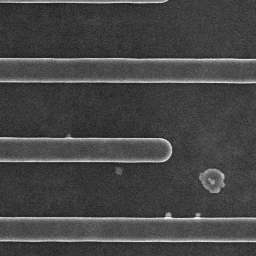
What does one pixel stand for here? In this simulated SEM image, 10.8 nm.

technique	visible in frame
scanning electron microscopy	groups of lines, slits or small figures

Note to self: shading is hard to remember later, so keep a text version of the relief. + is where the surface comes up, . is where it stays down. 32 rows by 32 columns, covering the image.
................................
................................
................................
................................
................................
................................
................................
++++++++++++++++++++++++++++++.+
++++++++++++++++++++++++++++++++
++++++++++++++++++++++++++++++++
................................
................................
................................
................................
................................
................................
................................
+++++++++++++++++++++...........
+++++++++++++++++++++...........
+++++++++++++++++++++...........
................................
................................
................................
................................
................................
................................
................................
++++++++++++++++++++++++++++++++
++++++++++++++++++++++++++++++++
++++++++++++++++++++++++++++++++
................................
................................